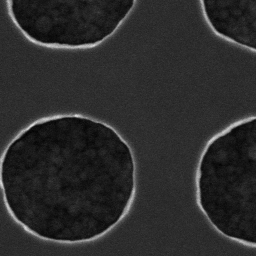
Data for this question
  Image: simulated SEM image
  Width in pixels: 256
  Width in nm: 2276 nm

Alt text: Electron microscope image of holes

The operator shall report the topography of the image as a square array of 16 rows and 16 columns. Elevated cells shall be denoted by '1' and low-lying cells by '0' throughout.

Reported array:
1000000011111000
1000000111111000
1100001111111100
1111111111111111
1111111111111111
1111111111111111
1111111111111111
1110001111111111
1000000111111100
0000000011111000
0000000011110000
0000000011110000
0000000011111000
1000000011111000
1100000111111100
1111111111111111